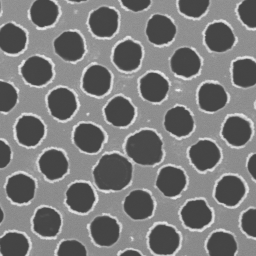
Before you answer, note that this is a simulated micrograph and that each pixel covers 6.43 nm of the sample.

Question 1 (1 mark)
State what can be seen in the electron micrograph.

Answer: a regular array of holes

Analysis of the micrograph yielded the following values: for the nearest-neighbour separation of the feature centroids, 263 nanometres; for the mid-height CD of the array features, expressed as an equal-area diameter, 186 nm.